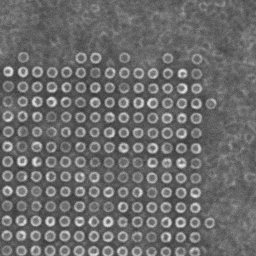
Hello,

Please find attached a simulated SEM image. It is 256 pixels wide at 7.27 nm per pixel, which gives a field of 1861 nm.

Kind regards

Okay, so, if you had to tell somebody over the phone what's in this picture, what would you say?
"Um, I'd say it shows a regular array of raised bodies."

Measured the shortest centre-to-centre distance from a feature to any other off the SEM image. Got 103 nm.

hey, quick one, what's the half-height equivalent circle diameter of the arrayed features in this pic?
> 69.6 nm